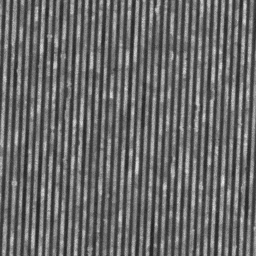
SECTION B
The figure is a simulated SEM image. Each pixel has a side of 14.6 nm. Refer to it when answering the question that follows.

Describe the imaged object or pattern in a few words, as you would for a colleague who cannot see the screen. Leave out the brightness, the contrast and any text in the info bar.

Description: parallel lines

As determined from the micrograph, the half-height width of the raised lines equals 41.9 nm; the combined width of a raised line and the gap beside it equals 105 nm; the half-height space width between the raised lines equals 56.5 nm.